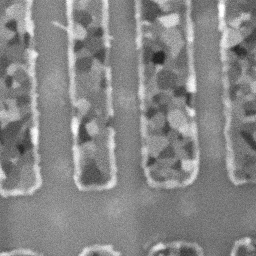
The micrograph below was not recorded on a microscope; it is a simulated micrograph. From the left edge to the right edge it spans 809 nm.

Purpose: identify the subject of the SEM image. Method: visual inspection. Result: one or a few lines or trenches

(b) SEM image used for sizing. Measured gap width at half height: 0.107 microns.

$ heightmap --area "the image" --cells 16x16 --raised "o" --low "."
oo..ooo..ooo..oo
oo..ooo..ooo..oo
oo..ooo..ooo..oo
oo..ooo..ooo..oo
oo...oo..ooo..oo
oo...oo..ooo..oo
oo...oo..ooo..oo
oo...oo..ooo..oo
oo...oo..ooo..oo
oo...oo..ooo..oo
oo...oo..ooo..oo
oo...oo...o.....
................
................
................
..........oo...o